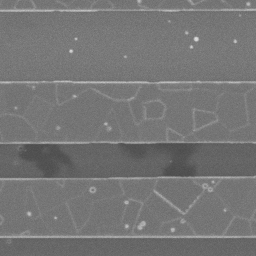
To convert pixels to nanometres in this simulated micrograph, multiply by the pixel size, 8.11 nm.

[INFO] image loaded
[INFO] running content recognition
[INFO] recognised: lines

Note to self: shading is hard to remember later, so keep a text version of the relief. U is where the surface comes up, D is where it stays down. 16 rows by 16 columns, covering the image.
UUUUUUUUUUUUUUUU
DDDDDDDDDDDDDDDD
DDDDDDDDDDDDDDDD
DDDDDDDDDDDDDDDD
DDDDDDDDDDDDDDDD
UUUUUUUUUUUUUUUU
UUUUUUUUUUUUUUUU
UUUUUUUUUUUUUUUU
UUUUUUUUUUUUUUUU
DDDDDDDDDDDDDDDD
DDDDDDDDDDDDDDDD
UUUUUUUUUUUUUUUU
UUUUUUUUUUUUUUUU
UUUUUUUUUUUUUUUU
UUUUUUUUUUUUUUUU
DDDDDDDDDDDDDDDD